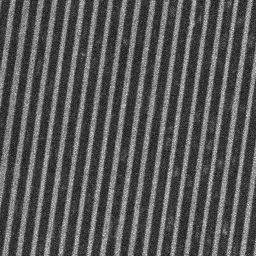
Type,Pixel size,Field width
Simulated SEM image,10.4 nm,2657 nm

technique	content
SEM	parallel lines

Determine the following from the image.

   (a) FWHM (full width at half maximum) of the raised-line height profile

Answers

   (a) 48.8 nm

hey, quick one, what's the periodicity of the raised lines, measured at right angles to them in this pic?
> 143 nanometers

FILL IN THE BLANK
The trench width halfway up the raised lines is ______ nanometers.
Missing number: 98.9